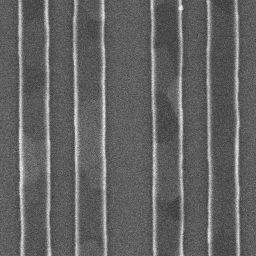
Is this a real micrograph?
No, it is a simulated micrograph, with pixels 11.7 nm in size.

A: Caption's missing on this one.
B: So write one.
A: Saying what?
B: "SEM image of wiring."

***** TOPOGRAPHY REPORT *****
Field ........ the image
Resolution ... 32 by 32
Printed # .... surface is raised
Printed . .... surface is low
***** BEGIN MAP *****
..####...####......####...####..
..####...####......####...####..
..####...####......####...####..
..####...####......####...####..
..####...####......####...####..
..####...####......####...####..
..####...####......####...####..
..####...####......####...####..
...###...####......####...####..
...###...####......####...####..
...###...####......####...####..
...###...####......####...####..
...###...####......####...####..
...###...####......####...####..
...###...####......####...####..
...###...####......####...####..
...###....###......####...####..
...###....###......####...####..
...###....###......####...####..
...###....###......####...####..
...###....###......####...####..
...###....###......####...####..
...###....###......####...####..
...###....###......####...####..
...###....###......####...####..
...###....###......####...####..
...###....###......####...####..
...###....###......####...####..
...###....###......####...####..
...###....###......####...####..
...###....###......####...####..
...###....###......####...####..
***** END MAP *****